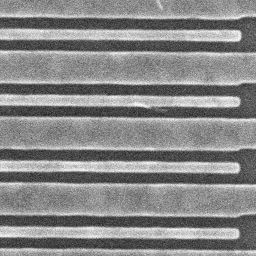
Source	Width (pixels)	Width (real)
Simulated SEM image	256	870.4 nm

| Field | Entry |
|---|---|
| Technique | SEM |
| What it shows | wiring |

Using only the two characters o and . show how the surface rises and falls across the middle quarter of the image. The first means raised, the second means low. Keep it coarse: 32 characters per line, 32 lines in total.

oooooooooooooooooooooooooooooooo
oooooooooooooooooooooooooooooooo
oooooooooooooooooooooooooooooooo
oooooooooooooooooooooooooooooooo
oooooooooooooooooooooooooooooooo
................................
................................
................................
oooooooooooooooooooooooooooooooo
oooooooooooooooooooooooooooooooo
....................oo..........
................................
................................
ooooooooooooooooo...............
oooooooooooooooooooooooooooooooo
oooooooooooooooooooooooooooooooo
oooooooooooooooooooooooooooooooo
oooooooooooooooooooooooooooooooo
oooooooooooooooooooooooooooooooo
oooooooooooooooooooooooooooooooo
oooooooooooooooooooooooooooooooo
.....................oooooo.oooo
................................
................................
...........oo...................
oooooooooooooooooooooooooooooooo
oooooooooooooooooooooooooooooooo
................................
................................
................................
oooooooooooooooooooooooooooooooo
oooooooooooooooooooooooooooooooo